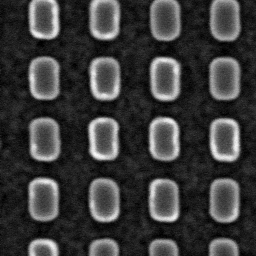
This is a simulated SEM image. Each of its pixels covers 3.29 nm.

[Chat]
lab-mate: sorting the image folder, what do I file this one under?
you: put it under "a regular array of raised bodies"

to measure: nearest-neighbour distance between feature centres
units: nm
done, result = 196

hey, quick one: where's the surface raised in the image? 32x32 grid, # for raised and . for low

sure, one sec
....###....####....###.....###..
....###....####....###....####..
....###....####....###....####..
....###....####....####...####..
....###.....##.....###.....###..
................................
................................
....###.....##.....###.....##...
....###....####....###....####..
....###....####....###....####..
....###....####....###....####..
....###.....###....###....####..
................................
................................
................................
....###....####....###....####..
....###....####....###....####..
....###....####....###....####..
....###....####....###....####..
....###.....##.....###.....###..
................................
................................
....##......##.....##......##...
....###....####....###....####..
....###....####....###....####..
....###....####....###....####..
....###....####....###....####..
.....#......##.....###.....##...
................................
................................
....###.....###....###....###...
....###....####....###....####..